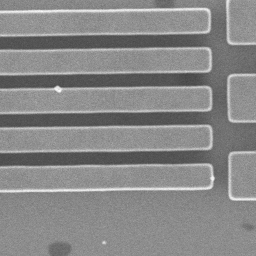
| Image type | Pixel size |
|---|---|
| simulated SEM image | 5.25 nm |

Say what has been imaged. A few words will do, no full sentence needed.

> groups of lines, slits or small figures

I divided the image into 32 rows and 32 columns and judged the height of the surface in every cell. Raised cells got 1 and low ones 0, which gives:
00000000000000000000000000001111
11111111111111111111111111001111
11111111111111111111111111001111
11111111111111111111111111001111
00000000000000000000000000001111
00000000000000000000000000000111
11111111111111111111111111000000
11111111111111111111111111000000
11111111111111111111111111000000
00000000000000000000000000000111
00000000000000000000000000001111
11111111111111111111111111001111
11111111111111111111111111000111
11111111111111111111111111000111
00000000000000000000000000000111
00000000000000000000000000000000
11111111111111111111111111000000
11111111111111111111111111000000
11111111111111111111111111000000
00000000000000000000000000000111
00000000000000000000000000000111
11111111111111111111111111100111
11111111111111111111111111100111
11111111111111111111111111000111
00000000000000000000000000000111
00000000000000000000000000000000
00000000000000000000000000000000
00000000000000000000000000000000
00000000000000000000000000000000
00000000000000000000000000000000
00000000000000000000000000000000
00000000000000000000000000000000